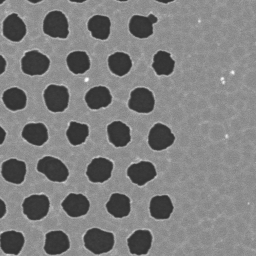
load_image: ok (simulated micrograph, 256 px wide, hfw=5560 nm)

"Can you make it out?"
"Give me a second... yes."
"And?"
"a regular array of holes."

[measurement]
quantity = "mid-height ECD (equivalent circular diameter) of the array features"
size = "0.555 um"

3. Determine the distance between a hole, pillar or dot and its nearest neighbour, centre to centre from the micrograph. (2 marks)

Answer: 0.877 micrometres